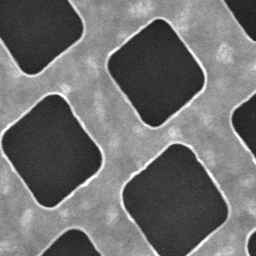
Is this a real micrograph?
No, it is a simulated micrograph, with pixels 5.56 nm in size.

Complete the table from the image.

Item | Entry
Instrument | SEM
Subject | holes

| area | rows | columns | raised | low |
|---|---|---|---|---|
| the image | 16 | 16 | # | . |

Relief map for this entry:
.....#########..
.....####..####.
.....###...#####
#...###.....####
#######......###
#######......###
##..####....###.
#....####.#####.
......#########.
......####..####
#.....###....###
##...###.....###
##..####......##
########......##
####.####....###
###...####..###.